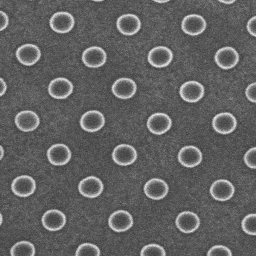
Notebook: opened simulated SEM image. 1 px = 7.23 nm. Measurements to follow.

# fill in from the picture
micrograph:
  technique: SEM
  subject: a regular array of raised bodies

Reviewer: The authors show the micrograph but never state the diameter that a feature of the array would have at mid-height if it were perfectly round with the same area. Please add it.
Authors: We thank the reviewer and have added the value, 21.4 pixels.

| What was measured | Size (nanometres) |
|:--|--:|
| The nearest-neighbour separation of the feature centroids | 328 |